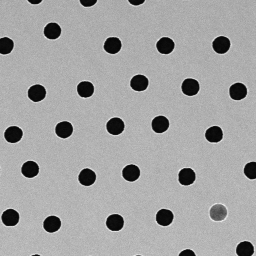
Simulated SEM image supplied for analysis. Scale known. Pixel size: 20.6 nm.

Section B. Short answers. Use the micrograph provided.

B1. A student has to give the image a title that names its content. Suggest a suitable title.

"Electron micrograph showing a regular array of holes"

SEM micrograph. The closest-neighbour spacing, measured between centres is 939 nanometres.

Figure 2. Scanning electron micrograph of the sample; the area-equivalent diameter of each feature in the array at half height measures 365 nanometres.